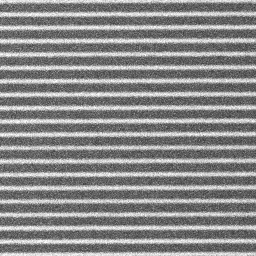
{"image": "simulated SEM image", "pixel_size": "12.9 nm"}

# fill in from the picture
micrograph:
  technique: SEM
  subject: parallel lines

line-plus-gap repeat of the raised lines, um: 0.173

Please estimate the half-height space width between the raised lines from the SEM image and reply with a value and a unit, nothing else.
144 nm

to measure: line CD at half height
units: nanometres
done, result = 30.7